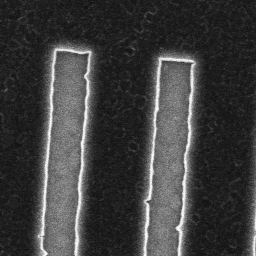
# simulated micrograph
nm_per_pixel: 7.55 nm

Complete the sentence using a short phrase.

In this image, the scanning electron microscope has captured one or a few lines or trenches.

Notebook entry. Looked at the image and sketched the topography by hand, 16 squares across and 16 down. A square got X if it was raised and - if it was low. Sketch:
XXXXXXXXXXXXXXXX
XXXXXXXXXXXXXXXX
XXXXXXXXXXXXXXXX
XXX--XXXXXXXXXXX
XXX--XXXXX--XXXX
XXX--XXXXX--XXXX
XXX--XXXXX--XXXX
XXX--XXXXX--XXXX
XXX--XXXXX--XXXX
XXX--XXXXX--XXXX
XXX--XXXX---XXXX
XXX--XXXX--XXXXX
XXX--XXXX--XXXXX
XXX--XXXX--XXXXX
XXX--XXXX--XXXXX
XXX--XXXX--XXXXX